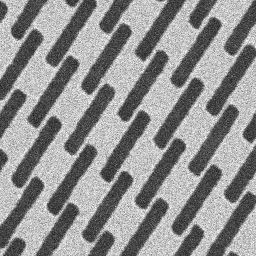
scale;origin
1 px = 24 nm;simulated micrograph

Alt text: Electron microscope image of a regular array of holes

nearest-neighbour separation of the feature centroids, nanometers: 1080